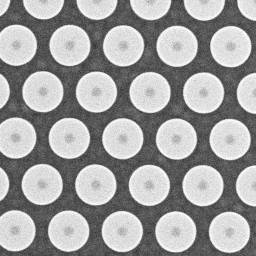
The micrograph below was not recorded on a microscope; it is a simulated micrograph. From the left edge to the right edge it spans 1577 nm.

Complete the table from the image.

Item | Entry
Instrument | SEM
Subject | an array of small figures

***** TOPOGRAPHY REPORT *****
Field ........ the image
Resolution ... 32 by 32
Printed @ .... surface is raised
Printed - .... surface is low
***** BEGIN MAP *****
@--@@@@@--@@@@@-@@@@@--@@@@@--@@
@---@@@---@@@@---@@@@---@@@@--@@
--------------------------------
-@@----@@@----@@@----@@-----@@--
@@@@---@@@@--@@@@@--@@@@---@@@@-
@@@@--@@@@@--@@@@@--@@@@@-@@@@@-
@@@@--@@@@@--@@@@@--@@@@@-@@@@@-
@@@@---@@@----@@@---@@@@---@@@@-
--------------------------------
----@@@----@@@---@@@----@@@----@
@--@@@@@--@@@@--@@@@@--@@@@@--@@
@--@@@@@--@@@@@-@@@@@--@@@@@--@@
@--@@@@@--@@@@--@@@@@--@@@@@--@@
----@@@----@@@---@@@----@@@---@@
--------------------------------
@@@@---@@@----@@@---@@@@---@@@--
@@@@--@@@@@--@@@@@--@@@@--@@@@@-
@@@@--@@@@@--@@@@@--@@@@@-@@@@@-
@@@@--@@@@@--@@@@@--@@@@--@@@@@-
-@@-----@@----@@@----@@----@@@--
--------------------------------
@--@@@@---@@@@---@@@@---@@@---@@
@--@@@@@--@@@@--@@@@@--@@@@@--@@
@--@@@@@--@@@@--@@@@@--@@@@@--@@
@--@@@@---@@@@---@@@@--@@@@@--@@
-----@-----@@-----@@----@@-----@
-@@-----@------@----------------
@@@@--@@@@@--@@@@---@@@@---@@@@-
@@@@--@@@@@--@@@@@--@@@@--@@@@@-
@@@@--@@@@@--@@@@@--@@@@--@@@@@-
@@@@---@@@@--@@@@---@@@@---@@@@-
----------------------------@---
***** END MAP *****